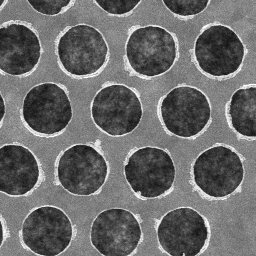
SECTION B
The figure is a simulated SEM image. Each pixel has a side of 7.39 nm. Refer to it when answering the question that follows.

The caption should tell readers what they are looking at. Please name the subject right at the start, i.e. a regular array of holes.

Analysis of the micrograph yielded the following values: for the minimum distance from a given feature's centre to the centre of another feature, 504 nanometers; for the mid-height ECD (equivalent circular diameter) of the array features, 372 nm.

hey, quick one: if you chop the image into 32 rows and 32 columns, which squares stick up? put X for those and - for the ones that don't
XXXX-----XXX-----XXXX-----XXXXXX
XXXXX--XXXXXX---XXXXXX---XXXXXXX
XXXXXXXXXXXXXXXXXXXXXXXXXXXXXXXX
----XXXXX---XXXXXX--XXXXXX---XXX
-----XXX-----XXX------XXX-----XX
-----XX------XXX------XX------XX
-----XX------XXX------XX-------X
-----XX------XXX------XXX-----XX
----XXXX-----XXXX----XXXX-----XX
XXXXXXXXXXXXXXXXXX-XXXXXXXX-XXXX
XXXXX--XXXXXXX-XXXXXXXXXXXXXXXXX
XXXX----XXXX-----XXXX----XXXX---
XXX------XXX-----XXX------XXX---
-XX------XX-------XX------XXX---
-XX------XXX------XX------XXX---
XXX-----XXXX-----XXXX-----XXX---
XXXX---XXXXXX---XXXXX----XXXXX--
XXXXXXXXXXXXXXXXXXXXXXXXXXXXXXXX
---XXXXXX---XXXXXX-XXXXXXX--XXXX
----XXXX-----XXX-----XXXX-----XX
-----XX------XXX------XX------XX
-----XX------XXX------XX------XX
-----XX------XXX------XX------XX
----XXXX----XXXX-----XXXX-----XX
XXXXXXXXXXXXXXXXXX--XXXXXX--XXXX
XXXXXXXXXXXXXXXXXXXXXXXXXXXXXXXX
XXXX----XXXXX---XXXXX----XXXXXXX
XXX------XXX-----XXX-----XXXXXXX
XXX------XXX------XX------XXXXXX
XXX------XX-------XX------XXXXXX
XXX------XXX-----XXX------XXXXXX
XXXX----XXXX-----XXXX----XXXXXXX